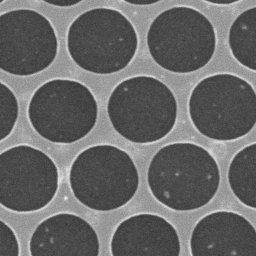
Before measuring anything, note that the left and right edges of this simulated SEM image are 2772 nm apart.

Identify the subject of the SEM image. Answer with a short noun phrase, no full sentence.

holes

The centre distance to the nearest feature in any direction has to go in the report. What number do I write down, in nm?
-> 851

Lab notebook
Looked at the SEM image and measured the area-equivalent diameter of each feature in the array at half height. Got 67.7 px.